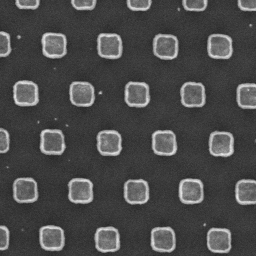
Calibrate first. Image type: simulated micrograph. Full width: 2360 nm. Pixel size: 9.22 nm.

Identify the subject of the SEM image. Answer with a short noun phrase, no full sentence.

a regular array of raised bodies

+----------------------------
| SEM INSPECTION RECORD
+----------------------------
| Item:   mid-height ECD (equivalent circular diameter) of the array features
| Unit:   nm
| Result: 226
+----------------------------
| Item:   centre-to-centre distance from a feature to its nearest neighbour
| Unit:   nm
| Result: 507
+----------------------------